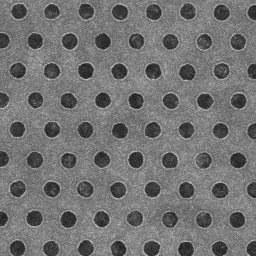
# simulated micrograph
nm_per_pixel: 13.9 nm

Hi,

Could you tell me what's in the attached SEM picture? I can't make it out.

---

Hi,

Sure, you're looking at a regular array of holes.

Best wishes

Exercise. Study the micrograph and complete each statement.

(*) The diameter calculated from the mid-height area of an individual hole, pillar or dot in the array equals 16.8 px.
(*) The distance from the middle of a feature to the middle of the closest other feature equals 463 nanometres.